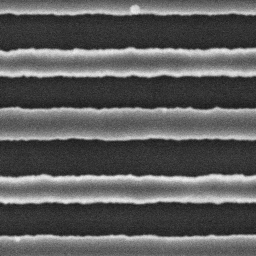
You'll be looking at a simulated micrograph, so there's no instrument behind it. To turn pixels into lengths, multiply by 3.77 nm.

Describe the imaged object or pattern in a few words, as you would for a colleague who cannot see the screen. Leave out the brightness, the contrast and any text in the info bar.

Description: lines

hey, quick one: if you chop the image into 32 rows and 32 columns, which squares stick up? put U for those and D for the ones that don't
UUUUUUUUUUUUUUUUUUUUUUUUUUUUUUUU
UUUUUUUUUUUUUUUUUUUUUUUUUUUUUUUU
DDDDDDDDDDDDDDDDDDDDDDDDDDDDDDDD
DDDDDDDDDDDDDDDDDDDDDDDDDDDDDDDD
DDDDDDDDDDDDDDDDDDDDDDDDDDDDDDDD
DDDDDDDDDDDDDDDDDDDDDDDDDDDDDDDD
UUUUUUUUUUUUUUUUUUUUUUUUUUUUUUUU
UUUUUUUUUUUUUUUUUUUUUUUUUUUUUUUU
UUUUUUUUUUUUUUUUUUUUUUUUUUUUUUUU
DUDDUUDDUUUUUDUUDUUDDDUDDDDDDDDD
DDDDDDDDDDDDDDDDDDDDDDDDDDDDDDDD
DDDDDDDDDDDDDDDDDDDDDDDDDDDDDDDD
DDDDDDDDDDDDDDDDDDDDDDDDDDDDDDDD
DDDDDDDDDDDDDDDDDDDDDDDDDDDDDDDD
UUUUUUUUUUUUUUUUUUUUUUUUUUUUUUUU
UUUUUUUUUUUUUUUUUUUUUUUUUUUUUUUU
UUUUUUUUUUUUUUUUUUUUUUUUUUUUUUUU
UUUUDUDDDDDDDUUUDDDDDDDDDDDDDDDU
DDDDDDDDDDDDDDDDDDDDDDDDDDDDDDDD
DDDDDDDDDDDDDDDDDDDDDDDDDDDDDDDD
DDDDDDDDDDDDDDDDDDDDDDDDDDDDDDDD
DDDDDDDDDDDDDDDDDDDDDDDDDDDDDDDD
UUUUUUUUUUUUUUUUUUUUUUUUUUUUUUUU
UUUUUUUUUUUUUUUUUUUUUUUUUUUUUUUU
UUUUUUUUUUUUUUUUUUUUUUUUUUUUUUUU
DDDDDDDDDDDDDDDDDDDDDDDDDDDDDDDD
DDDDDDDDDDDDDDDDDDDDDDDDDDDDDDDD
DDDDDDDDDDDDDDDDDDDDDDDDDDDDDDDD
DDDDDDDDDDDDDDDDDDDDDDDDDDDDDDDD
DDDDUUUDDDDDDUUUDDUDDDDDDDUDDUUU
UUUUUUUUUUUUUUUUUUUUUUUUUUUUUUUU
UUUUUUUUUUUUUUUUUUUUUUUUUUUUUUUU